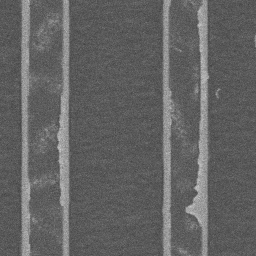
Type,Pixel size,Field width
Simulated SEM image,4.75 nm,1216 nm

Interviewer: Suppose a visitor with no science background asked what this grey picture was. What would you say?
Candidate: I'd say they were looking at one or a few lines or trenches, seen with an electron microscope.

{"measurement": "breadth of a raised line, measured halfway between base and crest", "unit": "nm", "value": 200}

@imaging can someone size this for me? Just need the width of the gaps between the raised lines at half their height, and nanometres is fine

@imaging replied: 472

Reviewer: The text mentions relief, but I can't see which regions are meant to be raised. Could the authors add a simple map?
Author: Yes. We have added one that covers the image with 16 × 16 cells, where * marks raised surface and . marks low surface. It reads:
..**......***...
..**......***...
..**......***...
.***......***...
.***......***...
.***......***...
..**......***...
..**......***...
..**......***...
..**......***...
..**......***...
..**......***...
..**......***...
..**......***...
..**......***...
..**......***...